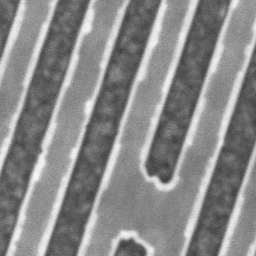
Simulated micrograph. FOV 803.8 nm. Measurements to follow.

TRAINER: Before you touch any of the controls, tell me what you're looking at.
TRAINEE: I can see one or a few lines or trenches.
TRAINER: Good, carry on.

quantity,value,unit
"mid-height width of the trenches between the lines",109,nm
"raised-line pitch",210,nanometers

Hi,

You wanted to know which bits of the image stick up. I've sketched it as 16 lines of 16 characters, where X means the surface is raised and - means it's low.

-XX---XX--XX--XX
-XX--XX---XX--XX
-XX--XX--XX---XX
XX---XX--XX--XXX
XX--XX---XX--XX-
XX--XX--XX---XX-
X---XX--XX--XXX-
X--XX---XX--XX--
X--XX--XX---XX--
---XX--XX--XXX--
--XX---XX--XX---
--XX--XXXXXXX--X
--XX--XXXXXXX--X
-XX---XXXXXX---X
-XX--XXXXXXX--XX
-XX--XX--XXX--XX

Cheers